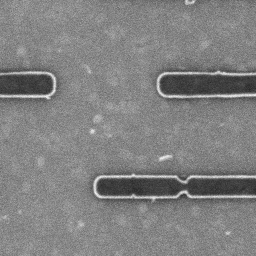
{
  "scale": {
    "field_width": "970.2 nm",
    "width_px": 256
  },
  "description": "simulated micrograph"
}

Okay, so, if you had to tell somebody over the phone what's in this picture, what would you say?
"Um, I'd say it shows one or a few lines or trenches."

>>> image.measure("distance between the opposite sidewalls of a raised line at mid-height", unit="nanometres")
83.9